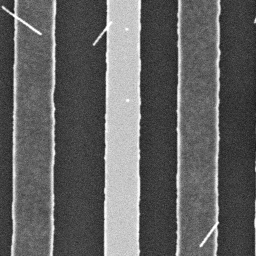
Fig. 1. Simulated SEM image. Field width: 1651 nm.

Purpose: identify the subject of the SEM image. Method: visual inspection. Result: lines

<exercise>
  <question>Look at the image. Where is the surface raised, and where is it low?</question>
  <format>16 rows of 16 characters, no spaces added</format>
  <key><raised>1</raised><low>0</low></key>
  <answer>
0110000110011100
0110000110011100
0110000110011100
0110000110011100
0110000110011100
0110000110011100
0110000110011100
0110000110011100
0110000110011100
0110000110011100
0110000110011100
0110000110011100
0110000110011100
0110000110011100
0110000110011100
0110000110011100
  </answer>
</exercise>